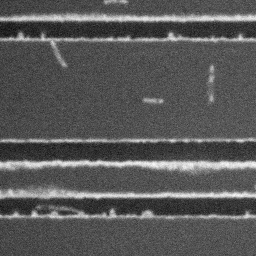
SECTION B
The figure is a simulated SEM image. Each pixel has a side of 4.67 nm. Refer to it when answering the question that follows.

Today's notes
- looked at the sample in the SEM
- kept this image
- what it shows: lines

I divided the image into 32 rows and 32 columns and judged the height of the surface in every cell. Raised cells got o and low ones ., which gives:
oooooooooooooooooooooooooooooooo
oooooooooooooooooooooooooooooooo
o.................o.............
................................
................................
oooooooooooooooooooooooooooooooo
oooooooooooooooooooooooooooooooo
oooooooooooooooooooooooooooooooo
oooooooooooooooooooooooooooooooo
oooooooooooooooooooooooooooooooo
oooooooooooooooooooooooooooooooo
oooooooooooooooooooooooooooooooo
oooooooooooooooooooooooooooooooo
oooooooooooooooooooooooooooooooo
oooooooooooooooooooooooooooooooo
oooooooooooooooooooooooooooooooo
oooooooooooooooooooooooooooooooo
oooooooooooooooooooooooooooooooo
................................
................................
...o.oooooooooooooooo.........oo
oooooooooooooooooooooooooooooooo
oooooooooooooooooooooooooooooooo
oooooooooooooooooooooooooooooooo
............o.....o.............
................................
................................
oooooooooooooooooooooooooooooooo
oooooooooooooooooooooooooooooooo
oooooooooooooooooooooooooooooooo
oooooooooooooooooooooooooooooooo
oooooooooooooooooooooooooooooooo